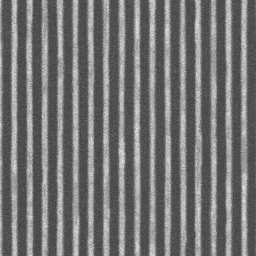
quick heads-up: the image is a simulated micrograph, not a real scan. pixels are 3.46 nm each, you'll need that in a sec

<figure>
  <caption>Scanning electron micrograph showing parallel lines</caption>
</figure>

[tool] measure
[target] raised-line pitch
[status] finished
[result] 53 nm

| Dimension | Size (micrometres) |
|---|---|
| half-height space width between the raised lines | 0.0337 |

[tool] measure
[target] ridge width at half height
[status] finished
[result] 18.1 nanometers